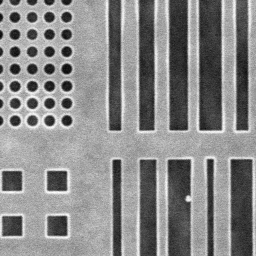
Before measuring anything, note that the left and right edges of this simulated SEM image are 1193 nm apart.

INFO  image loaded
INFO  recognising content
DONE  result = groups of lines, slits or small figures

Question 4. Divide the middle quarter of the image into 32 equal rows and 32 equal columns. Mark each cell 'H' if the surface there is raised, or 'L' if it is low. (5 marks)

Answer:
LLHHHHHHHHHLLLLHHHLLLLLHHHLLLLLH
LLHHHHHHHHHLLLLHHHLLLLLHHHLLLLLH
LLHHHHHHHHHLLLLHHHLLLLLHHHLLLLLH
HHHHHHHHHHHLLLLHHHLLLLLHHHLLLLLH
LLHHHHHHHHHLLLLHHHLLLLLHHHLLLLLH
LLHHHHHHHHHLLLLHHHLLLLLHHHLLLLLH
LLHHHHHHHHHLLLLHHHLLLLLHHHLLLLLH
HHHHHHHHHHHLLLLHHHLLLLLHHHLLLLLH
LLHHHHHHHHHLLLLHHHLLLLLHHHLLLLLH
LLHHHHHHHHHLLLLHHHLLLLLHHHLLLLLH
LLHHHHHHHHHLLLLHHHHLLLLHHHLLLLLH
HHHHHHHHHHHLLLLHHHHLLLLHHHLLLLLH
HHHHHHHHHHHLLLLHHHHLLLLHHHLLLLLH
LLHHHHHHHHHLLLLHHHHLLLLHHHLLLLLH
LLHHHHHHHHHLLLLHHHHLLLLHHHLLLLLH
LHHHHHHHHHHLLLLHHHHLLLLHHHLLLLLH
HHHHHHHHHHHLLLHHHHLLLLLHHHLLLLLH
HHHHHHHHHHHHHHHHHHHHHHHHHHHHHHHH
HHHHHHHHHHHHHHHHHHHHHHHHHHHHHHHH
HHHHHHHHHHHHHHHHHHHHHHHHHHHHHHHH
HHHHHHHHHHHHHHHHHHHHHHHHHHHHHHHH
HHHHHHHHHHHHHHHHHHHHHHHHHHHHHHHH
HHHHHHHHHHHHHHHHHHHHHHHHHHHHHHHH
HHHHHHHHHHHHHHHHHHHHHHHHHHHHHHHH
HHHHHHHHHHHHLLHHHHHLLLLHHHLLLLLL
HHHHHHHHHHHHLLLHHHHLLLLHHHLLLLLL
HHHHHHHHHHHHLLLHHHHLLLLHHHLLLLLL
LHHHHHHHHHHHLLLHHHHLLLLHHHLLLLLL
LHHHHHHHHHHHLLHHHHHLLLLHHHLLLLLL
LHHHHHHHHHHHLLHHHHHLLLLHHHLLLLLL
LHHHHHHHHHHHLLHHHHHLLLLHHHLLLLLL
LHHHHHHHHHHHLLLHHHHLLLLHHHLLLLLL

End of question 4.